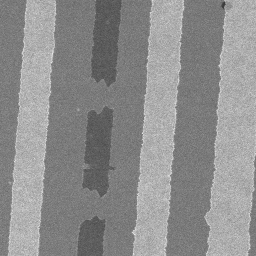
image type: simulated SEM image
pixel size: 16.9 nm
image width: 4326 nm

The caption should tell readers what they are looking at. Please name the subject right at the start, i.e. one or a few lines or trenches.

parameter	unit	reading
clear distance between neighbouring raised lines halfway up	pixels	38.9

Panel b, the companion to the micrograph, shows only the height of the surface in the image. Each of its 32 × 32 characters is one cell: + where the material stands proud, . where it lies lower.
...++++.....+++....++++.....++++
...++++.....+++....++++.....++++
...++++.....+++....++++.....++++
...++++.....+++....++++.....++++
...++++.....+++....++++.....++++
...++++.....+++....++++.....++++
...++++....++++....+++......++++
...+++.....++++....+++......++++
...+++.....++++...+++++....+++++
...+++.....++++...++++......++++
...+++.......+....++++......++++
..++++............++++.....+++++
..++++............++++.....+++++
..++++.......+....++++.....+++++
..++++.....+++....++++.....+++++
..++++.....+++....++++.....+++++
..++++.....+++....++++.....+++++
..++++.....+++....++++.....+++++
..++++.....+++....++++.....+++++
..++++.....+++....++++.....+++++
..+++......+++....+++......+++++
..+++.....++++....+++......+++++
..+++.....++++...++++......+++++
..+++......+++...++++......+++++
..+++............++++.....+++++.
.++++............++++.....+++++.
.++++............++++.....+++++.
.++++......++....++++.....+++++.
.++++.....+++....++++.....+++++.
.++++.....+++....++++.....+++++.
.++++.....+++....++++.....+++++.
.++++.....+++....++++.....+++++.